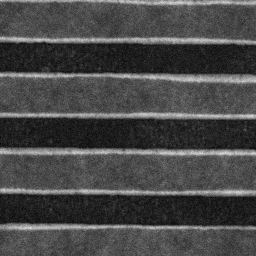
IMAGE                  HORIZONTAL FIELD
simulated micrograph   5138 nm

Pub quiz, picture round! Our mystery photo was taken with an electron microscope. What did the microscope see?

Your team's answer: lines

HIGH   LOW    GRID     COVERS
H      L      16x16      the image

HHHHHHHHHHHHHHHH
HHHHHHHHHHHHHHHH
HHHHHHHHHHHHHHHH
LLLLLLLLLLLLLLLL
LLLLLLLLLLLLLLLL
HHHHHHHHHHHHHHHH
HHHHHHHHHHHHHHHH
LLLLLLLLLLLLLLLL
LLLLLLLLLLLLLLLL
HHHHHHHHHHHHHHHH
HHHHHHHHHHHHHHHH
HHHHHHHHHHHHHHHH
LLLLLLLLLLLLLLLL
LLLLLLLLLLLLLLLL
HHHHHHHHHHHHHHHH
HHHHHHHHHHHHHHHH